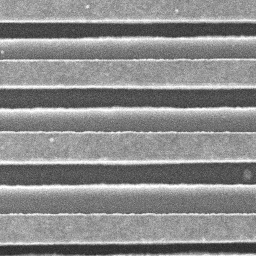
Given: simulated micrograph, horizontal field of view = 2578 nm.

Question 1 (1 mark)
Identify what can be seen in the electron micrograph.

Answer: lines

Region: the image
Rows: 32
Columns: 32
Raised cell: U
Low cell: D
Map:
UUUUUUUUUUUUUUUUUUUUUUUUUUUUUUUU
UUUUUUUUUUUUUUUUUUUUUUUUUUUUUUUU
UUUUUUUUUUUUUUUUUUUUUUUUUUUUUUUU
DDDDDDDDDDDDDDDDDDDDDDDDDDDDDDDD
DDDDDDDDDDDDDDDDDDDDDDDDDDDDDDDD
UUUUUUUUUUUUUUUUUUUUUUUUUUUUUUUU
UUUUUUUUUUUUUUUUUUUUUUUUUUUUUUUU
UUUUUUUUUUUUUUUUUUUUUUUUUUUUUUUU
UUUUUUUUUUUUUUUUUUUUUUUUUUUUUUUU
UUUUUUUUUUUUUUUUUUUUUUUUUUUUUUUU
UUUUUUUUUUUUUUUUUUUUUUUUUUUUUUUU
DDDDDDDDDDDDDDDDDDDDDDDDDDDDDDDD
DDDDDDDDDDDDDDDDDDDDDDDDDDDDDDDD
DDDDDDDDDDDDDDDDDDDDDDDDDDDDDDDD
UUUUUUUUUUUUUUUUUUUUUUUUUUUUUUUU
UUUUUUUUUUUUUUUUUUUUUUUUUUUUUUUU
UUUUUUUUUUUUUUUUUUUUUUUUUUUUUUUU
UUUUUUUUUUUUUUUUUUUUUUUUUUUUUUUU
UUUUUUUUUUUUUUUUUUUUUUUUUUUUUUUU
UUUUUUUUUUUUUUUUUUUUUUUUUUUUUUUU
DDDDDDDDDDDDDDDDDDDDDDDDDDDDDDDD
DDDDDDDDDDDDDDDDDDDDDDDDDDDDDDDD
DDDDDDDDDDDDDDDDDDDDDDDDDDDDDDDD
UUUUUUUUUUUUUUUUUUUUUUUUUUUUUUUU
UUUUUUUUUUUUUUUUUUUUUUUUUUUUUUUU
UUUUUUUUUUUUUUUUUUUUUUUUUUUUUUUU
UUUUUUUUUUUUUUUUUUUUUUUUUUUUUUUU
UUUUUUUUUUUUUUUUUUUUUUUUUUUUUUUU
UUUUUUUUUUUUUUUUUUUUUUUUUUUUUUUU
UUUUUUUUUUUUUUUUUUUUUUUUUUUUUUUU
DDDDDDDDDDDDDDDDDDDDDDDDDDDDDDDD
DDDDDDDDDDDDDDDDDDDDDDDDDDDDDDDD